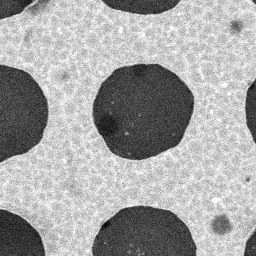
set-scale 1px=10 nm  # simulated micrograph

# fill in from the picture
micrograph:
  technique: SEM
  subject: holes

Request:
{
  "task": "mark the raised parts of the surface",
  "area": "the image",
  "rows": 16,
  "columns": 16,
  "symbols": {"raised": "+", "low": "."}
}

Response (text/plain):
..+++++....+++++
++++++++++++++++
++++++++++++++++
++++++++++++++++
..+++++....+++++
...+++......++++
...+++......+++.
...+++......+++.
...+++.....+++++
..+++++...++++++
++++++++++++++++
++++++++++++++++
++++++++++++++++
.++++++....+++++
..++++......++++
...+++......+++.